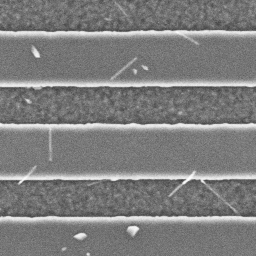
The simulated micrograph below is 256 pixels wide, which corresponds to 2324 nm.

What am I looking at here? lines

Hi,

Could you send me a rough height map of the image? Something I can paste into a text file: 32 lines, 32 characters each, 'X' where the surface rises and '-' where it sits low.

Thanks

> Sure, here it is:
--------------------------------
--------------------------------
--------------------------------
--------------------------------
XXXXXXXXXXXXXXXXXXXXXXXXXXXXXXXX
XXXXXXXXXXXXXXXXXXXXXXXXXXXXXXXX
XXXXXXXXXXXXXXXXXXXXXXXXXXXXXXXX
XXXXXXXXXXXXXXXXXXXXXXXXXXXXXXXX
XXXXXXXXXXXXXXXXXXXXXXXXXXXXXXXX
XXXXXXXXXXXXXXXXXXXXXXXXXXXXXXXX
XXXXXXXXXXXXXXXXXXXXXXXXXXXXXXXX
--------------------------------
--------------------------------
--------------------------------
--------------------------------
----------------X-----X---------
XXXXXXXXXXXXXXXXXXXXXXXXXXXXXXXX
XXXXXXXXXXXXXXXXXXXXXXXXXXXXXXXX
XXXXXXXXXXXXXXXXXXXXXXXXXXXXXXXX
XXXXXXXXXXXXXXXXXXXXXXXXXXXXXXXX
XXXXXXXXXXXXXXXXXXXXXXXXXXXXXXXX
XXXXXXXXXXXXXXXXXXXXXXXXXXXXXXXX
--X-----------------------------
--------------------------------
--------------------------------
--------------------------------
--------------------------------
XXXXXXXXXXXXXXXXXXXXXXXXXXXXXXXX
XXXXXXXXXXXXXXXXXXXXXXXXXXXXXXXX
XXXXXXXXXXXXXXXXXXXXXXXXXXXXXXXX
XXXXXXXXXXXXXXXXXXXXXXXXXXXXXXXX
XXXXXXXXXXXXXXXXXXXXXXXXXXXXXXXX